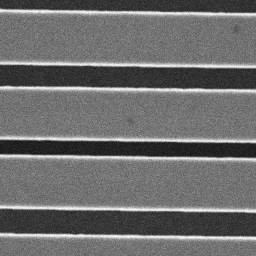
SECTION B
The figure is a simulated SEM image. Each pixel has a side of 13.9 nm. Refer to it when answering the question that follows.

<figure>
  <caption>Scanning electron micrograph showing lines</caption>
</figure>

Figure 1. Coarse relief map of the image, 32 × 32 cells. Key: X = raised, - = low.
--------------------------------
XXXXXXXXXXXXXXXXXXXX------------
XXXXXXXXXXXXXXXXXXXXXXXXXXXXXXXX
XXXXXXXXXXXXXXXXXXXXXXXXXXXXXXXX
XXXXXXXXXXXXXXXXXXXXXXXXXXXXXXXX
XXXXXXXXXXXXXXXXXXXXXXXXXXXXXXXX
XXXXXXXXXXXXXXXXXXXXXXXXXXXXXXXX
XXXXXXXXXXXXXXXXXXXXXXXXXXXXXXXX
--------------------------------
--------------------------------
--------------------------------
XXXXXXXXXXXXXXXXXXXXXXXXXXXXXXXX
XXXXXXXXXXXXXXXXXXXXXXXXXXXXXXXX
XXXXXXXXXXXXXXXXXXXXXXXXXXXXXXXX
XXXXXXXXXXXXXXXXXXXXXXXXXXXXXXXX
XXXXXXXXXXXXXXXXXXXXXXXXXXXXXXXX
XXXXXXXXXXXXXXXXXXXXXXXXXXXXXXXX
------XXXXXXXXXXXXXXXXXXXXXXXXXX
--------------------------------
XXXXXXXXXX----------------------
XXXXXXXXXXXXXXXXXXXXXXXXXXXXXXXX
XXXXXXXXXXXXXXXXXXXXXXXXXXXXXXXX
XXXXXXXXXXXXXXXXXXXXXXXXXXXXXXXX
XXXXXXXXXXXXXXXXXXXXXXXXXXXXXXXX
XXXXXXXXXXXXXXXXXXXXXXXXXXXXXXXX
XXXXXXXXXXXXXXXXXXXXXXXXXXXXXXXX
-------------------------------X
--------------------------------
--------------------------------
XXXXXXXXXXXXXXXXX---------------
XXXXXXXXXXXXXXXXXXXXXXXXXXXXXXXX
XXXXXXXXXXXXXXXXXXXXXXXXXXXXXXXX